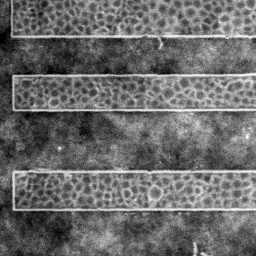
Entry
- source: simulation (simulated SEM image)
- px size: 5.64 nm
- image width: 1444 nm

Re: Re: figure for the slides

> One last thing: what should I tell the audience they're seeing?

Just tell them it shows one or a few lines or trenches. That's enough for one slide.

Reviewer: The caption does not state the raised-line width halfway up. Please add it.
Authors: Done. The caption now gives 199 nm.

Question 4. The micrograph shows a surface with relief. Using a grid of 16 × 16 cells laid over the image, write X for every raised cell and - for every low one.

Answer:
-XXXXXXXXXXXXXXX
-XXXXXXXXXXXXXXX
----------------
----------------
----------------
-XXXXXXXXXXXXXXX
-XXXXXXXXXXXXXXX
----------------
----------------
----------------
----------------
-XXXXXXXXXXXXXXX
-XXXXXXXXXXXXXXX
----------------
----------------
----------------